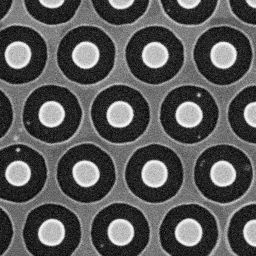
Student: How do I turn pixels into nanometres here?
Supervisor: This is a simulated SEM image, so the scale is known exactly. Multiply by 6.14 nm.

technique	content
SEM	an array of small figures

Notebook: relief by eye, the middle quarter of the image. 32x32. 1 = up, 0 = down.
00001110000011110000011100000011
00000000000011110000000000000111
00000000000111111000000000001111
10000000000111111100000000011111
11100000011111111111000001111111
11111111111000001111111111111000
01111111110000000011111111100000
00111111100000000001111111000000
00011111000000000000111110000000
00001110000001100000011100000000
00001110000011110000011100000111
00000100000111111000001100001111
00000100000111111000001100001111
00000110000111111000001100001111
00001110000111110000011100000111
00001110000011100000011100000011
00001111000000000000011110000000
00011111100000000000111111000000
00111111110000000001111111100000
11111111111000000111111111111000
11100000111111111111000001111111
10000000001111111100000000011111
00000000000111111000000000001111
00000000000011110000000000000111
00001100000011110000011100000111
00011111000001100000111110000011
00111111100001100000111111000011
00111111100001100000111111000011
00011111100001100000111111000011
00011111000001100000111110000011
00000110000001110000011100000111
00000000000011110000000000000111